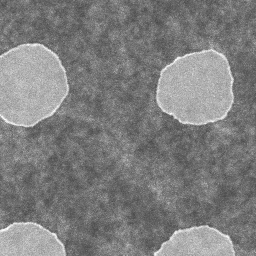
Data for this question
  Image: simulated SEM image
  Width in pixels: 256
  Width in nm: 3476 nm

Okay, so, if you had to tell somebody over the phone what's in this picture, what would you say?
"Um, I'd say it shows raised bodies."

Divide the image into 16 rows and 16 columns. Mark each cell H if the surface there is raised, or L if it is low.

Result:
LLLLLLLLLLLLLLLL
LLLLLLLLLLLLLLLL
LLLLLLLLLLLLLLLL
HHHLLLLLLLLLHHLL
HHHHLLLLLLHHHHLL
HHHHLLLLLLHHHHLL
HHHHLLLLLLHHHHLL
HHHLLLLLLLLHHHLL
LLLLLLLLLLLLLLLL
LLLLLLLLLLLLLLLL
LLLLLLLLLLLLLLLL
LLLLLLLLLLLLLLLL
LLLLLLLLLLLLLLLL
LLLLLLLLLLLLLLLL
HHHLLLLLLLLHHHLL
HHHHLLLLLLHHHHHL